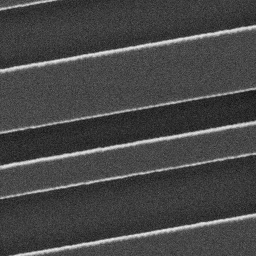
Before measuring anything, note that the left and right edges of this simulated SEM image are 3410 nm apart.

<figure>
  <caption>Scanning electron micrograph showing lines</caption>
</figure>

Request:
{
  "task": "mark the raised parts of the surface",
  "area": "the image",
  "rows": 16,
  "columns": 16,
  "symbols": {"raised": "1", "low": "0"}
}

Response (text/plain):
1000000000000000
0000000000000000
0000000000011111
0000011111111111
1111111111111111
1111111111111111
1111111111100000
1111100000000000
0000000000011111
0000011111111111
1111111111100000
1111100000000000
0000000000000000
0000000000000001
0000000001111111
0000111111111111